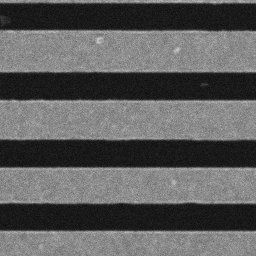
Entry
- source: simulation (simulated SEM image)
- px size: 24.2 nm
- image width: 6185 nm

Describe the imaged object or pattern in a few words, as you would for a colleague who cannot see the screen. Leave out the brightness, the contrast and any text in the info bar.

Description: lines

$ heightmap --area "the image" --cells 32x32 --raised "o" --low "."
................................
................................
................................
................................
oooooooooooooooooooooooooooooooo
oooooooooooooooooooooooooooooooo
oooooooooooooooooooooooooooooooo
oooooooooooooooooooooooooooooooo
oooooooooooooooooooooooooooooooo
................................
................................
................................
................................
oooooooooooooooooooooooooooooooo
oooooooooooooooooooooooooooooooo
oooooooooooooooooooooooooooooooo
oooooooooooooooooooooooooooooooo
................................
................................
................................
................................
oooooooooooooooooooooooooooooooo
oooooooooooooooooooooooooooooooo
oooooooooooooooooooooooooooooooo
oooooooooooooooooooooooooooooooo
................................
................................
................................
................................
oooooooooooooooooooooooooooooooo
oooooooooooooooooooooooooooooooo
oooooooooooooooooooooooooooooooo